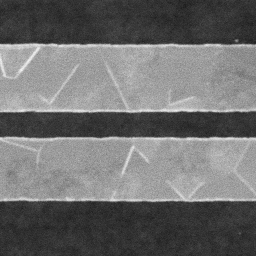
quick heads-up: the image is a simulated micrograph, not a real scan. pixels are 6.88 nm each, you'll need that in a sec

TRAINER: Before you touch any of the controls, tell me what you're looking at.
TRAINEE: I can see wiring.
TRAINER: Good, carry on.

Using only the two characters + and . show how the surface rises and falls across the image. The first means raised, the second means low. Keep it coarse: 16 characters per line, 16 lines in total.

................
................
................
++++++++++++++++
++++++++++++++++
++++++++++++++++
++++++++++++++++
................
................
++++++++++++++++
++++++++++++++++
++++++++++++++++
+.+++++++++++.++
................
................
................